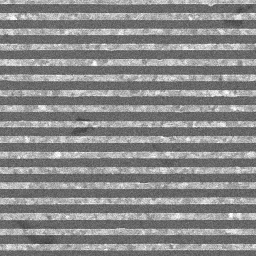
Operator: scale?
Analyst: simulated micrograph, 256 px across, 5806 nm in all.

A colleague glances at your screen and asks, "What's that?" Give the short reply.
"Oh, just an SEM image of parallel lines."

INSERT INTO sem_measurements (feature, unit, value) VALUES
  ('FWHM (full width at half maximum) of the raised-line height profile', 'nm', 145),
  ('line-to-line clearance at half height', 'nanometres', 210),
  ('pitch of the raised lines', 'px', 15.4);